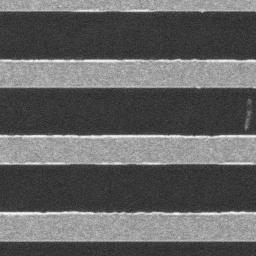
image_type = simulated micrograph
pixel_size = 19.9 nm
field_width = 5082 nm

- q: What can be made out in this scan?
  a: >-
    lines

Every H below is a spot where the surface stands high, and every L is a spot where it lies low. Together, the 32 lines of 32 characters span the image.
HHHHHHHHHHHHHHHHHHHHHHHHHHHHHHHH
LLLLLLLLLLLLLLLLLLLLLLLLLLLLLLLL
LLLLLLLLLLLLLLLLLLLLLLLLLLLLLLLL
LLLLLLLLLLLLLLLLLLLLLLLLLLLLLLLL
LLLLLLLLLLLLLLLLLLLLLLLLLLLLLLLL
LLLLLLLLLLLLLLLLLLLLLLLLLLLLLLLL
LLLLLLLLLLLLLLLLLLLLLLLLLLLLLLLL
LLLLLLLLLLLLLLLLLLLLLLLLLLLLLLLL
HHHHHHHHHHHHHHHHHHHHHHHHHHHHHHHH
HHHHHHHHHHHHHHHHHHHHHHHHHHHHHHHH
HHHHHHHHHHHHHHHHHHHHHHHHHHHHHHHH
LLLLLLLLLLLLLLLLLLLLLLLLLLLLLLLL
LLLLLLLLLLLLLLLLLLLLLLLLLLLLLLLL
LLLLLLLLLLLLLLLLLLLLLLLLLLLLLLLL
LLLLLLLLLLLLLLLLLLLLLLLLLLLLLLLL
LLLLLLLLLLLLLLLLLLLLLLLLLLLLLLLL
LLLLLLLLLLLLLLLLLLLLLLLLLLLLLLLL
HHHHHHHHHHHHHHHHHHHHHHHHHHHHHHHH
HHHHHHHHHHHHHHHHHHHHHHHHHHHHHHHH
HHHHHHHHHHHHHHHHHHHHHHHHHHHHHHHH
LLLLLLLLLLLLLLLLLLLLLLLLLLLLLLLL
LLLLLLLLLLLLLLLLLLLLLLLLLLLLLLLL
LLLLLLLLLLLLLLLLLLLLLLLLLLLLLLLL
LLLLLLLLLLLLLLLLLLLLLLLLLLLLLLLL
LLLLLLLLLLLLLLLLLLLLLLLLLLLLLLLL
LLLLLLLLLLLLLLLLLLLLLLLLLLLLLLLL
LLLLLLLLLLLLLLLLLLLLLLLLLLLLLLLL
HHHHHHHHHHHHHHHHHHHHHHHHHHHHHHHH
HHHHHHHHHHHHHHHHHHHHHHHHHHHHHHHH
HHHHHHHHHHHHHHHHHHHHHHHHHHHHHHHH
LLLLLLLLLLLLLLLLLLLLLLLLLLLLLLLL
LLLLLLLLLLLLLLLLLLLLLLLLLLLLLLLL